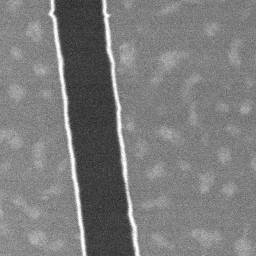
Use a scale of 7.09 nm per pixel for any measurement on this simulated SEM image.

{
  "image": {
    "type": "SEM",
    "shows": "one or a few lines or trenches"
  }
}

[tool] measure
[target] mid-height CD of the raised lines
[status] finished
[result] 363 nanometres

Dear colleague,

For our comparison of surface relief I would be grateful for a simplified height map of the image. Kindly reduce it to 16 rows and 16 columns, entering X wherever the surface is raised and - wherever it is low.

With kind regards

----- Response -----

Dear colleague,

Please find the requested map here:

---XXXX---------
---XXXX---------
----XXX---------
----XXX---------
----XXX---------
----XXX---------
----XXX---------
----XXX---------
----XXXX--------
----XXXX--------
-----XXX--------
-----XXX--------
-----XXX--------
-----XXX--------
-----XXX--------
-----XXXX-------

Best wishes